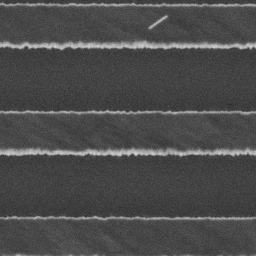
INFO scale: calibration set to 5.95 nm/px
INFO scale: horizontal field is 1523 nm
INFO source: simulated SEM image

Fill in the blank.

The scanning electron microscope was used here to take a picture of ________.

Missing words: lines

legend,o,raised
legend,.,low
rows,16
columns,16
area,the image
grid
oooooooooooooooo
oooooooooooooooo
oooooooooooooooo
................
................
................
................
oooooooooooooooo
oooooooooooooooo
oooooooooooooooo
................
................
................
................
oooooooooooooooo
oooooooooooooooo